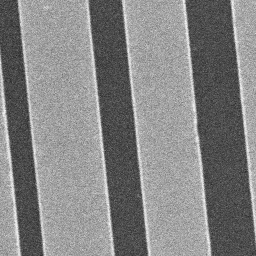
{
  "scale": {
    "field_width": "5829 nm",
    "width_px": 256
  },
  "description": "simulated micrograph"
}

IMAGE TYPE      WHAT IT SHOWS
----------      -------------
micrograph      one or a few lines or trenches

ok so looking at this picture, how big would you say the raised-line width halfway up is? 1470 nanometers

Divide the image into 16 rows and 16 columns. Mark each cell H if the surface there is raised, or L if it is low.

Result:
LHHHHLLLHHHHLLLH
LHHHHHLLHHHHLLLH
LHHHHHLLHHHHLLLH
LLHHHHLLHHHHLLLH
LLHHHHLLHHHHLLLH
LLHHHHLLHHHHLLLH
LLHHHHLLHHHHLLLH
LLHHHHLLHHHHLLLH
LLHHHHLLLHHHLLLH
HLHHHHLLLHHHLLLH
HLHHHHHLLHHHHLLL
HLHHHHHLLHHHHLLL
HLHHHHHLLHHHHLLL
HLLHHHHLLHHHHLLL
HLLHHHHLLHHHHLLL
HLLHHHHLLHHHHLLL